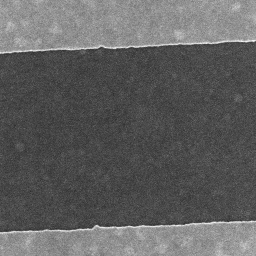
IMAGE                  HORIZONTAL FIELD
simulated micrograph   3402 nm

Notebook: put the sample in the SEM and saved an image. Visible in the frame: one or a few lines or trenches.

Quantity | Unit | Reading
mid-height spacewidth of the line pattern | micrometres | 2.39